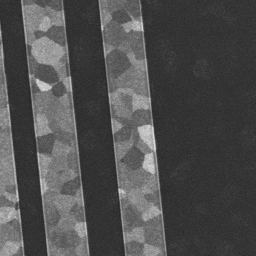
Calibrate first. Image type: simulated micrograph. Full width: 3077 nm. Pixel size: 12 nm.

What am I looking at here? one or a few lines or trenches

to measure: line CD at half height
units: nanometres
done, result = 487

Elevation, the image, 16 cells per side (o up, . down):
.ooo..ooo.......
..oo..ooo.......
..oo..ooo.......
..oo...oo.......
..oo...oo.......
..oo...oo.......
..ooo..oo.......
o.ooo..oo.......
o.ooo..ooo......
o.ooo..ooo......
o.ooo..ooo......
o..oo..ooo......
o..oo...oo......
o..oo...oo......
o..oo...oo......
o..ooo..oo......